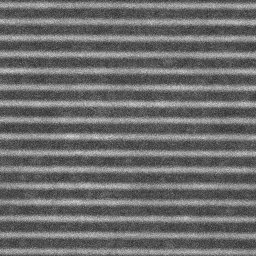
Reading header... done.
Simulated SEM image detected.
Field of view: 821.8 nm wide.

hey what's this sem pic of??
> parallel lines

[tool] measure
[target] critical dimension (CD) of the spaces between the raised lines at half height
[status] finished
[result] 37.4 nanometers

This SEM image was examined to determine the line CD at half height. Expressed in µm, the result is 0.0153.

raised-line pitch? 52.8 nm